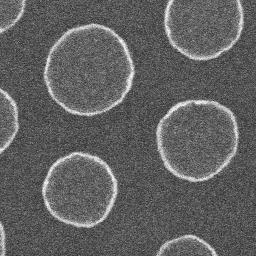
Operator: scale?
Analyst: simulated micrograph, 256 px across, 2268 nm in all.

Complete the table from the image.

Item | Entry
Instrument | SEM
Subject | raised bodies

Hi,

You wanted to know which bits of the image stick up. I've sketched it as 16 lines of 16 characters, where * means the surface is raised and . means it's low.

*.........*****.
*.........*****.
....****...****.
...*****....*...
...*****........
...*****........
*...***....**...
*.........*****.
*.........*****.
..........*****.
...****....***..
...****.........
...****.........
....***.........
................
..........***...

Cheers